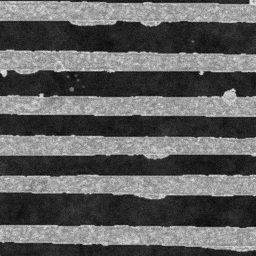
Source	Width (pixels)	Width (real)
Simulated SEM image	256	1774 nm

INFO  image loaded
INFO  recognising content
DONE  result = lines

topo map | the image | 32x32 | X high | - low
XXXXXXXXXXXXXXXXXXXXXXXXXXXX---X
XXXXXXXXXXXXXXXXXXXXXXXXXXXXXXXX
XXXXXXXXXXXXXXXXXXXXXXXXXXXXXXXX
--------------------------------
--------------------------------
--------------------------------
XXXXXXXXXX----------------------
XXXXXXXXXXXXXXXXXXXXXXXXXXXXXXXX
XXXXXXXXXXXXXXXXXXXXXXXXXXXXXXXX
--------------------------------
--------------------------------
----------------------------X---
XXXXXXXXXXXXXXXXXXXXXXXXXXXXXXXX
XXXXXXXXXXXXXXXXXXXXXXXXXXXXXXXX
-------------------------XXXXXXX
--------------------------------
--------------------------------
XXXXXXXXXXXXXXXXXXXXXXXXXXXXXXXX
XXXXXXXXXXXXXXXXXXXXXXXXXXXXXXXX
-------------------X------------
--------------------------------
--------------------------------
XXXXXXXXXXXXXXXXXXXXXXXXXXXXXXXX
XXXXXXXXXXXXXXXXXXXXXXXXXXXXXXXX
-------------------X------------
--------------------------------
--------------------------------
--------------------------------
XXXXXXXXXXXXXXXXXXXXXXXXXXXXXXXX
XXXXXXXXXXXXXXXXXXXXXXXXXXXXXXXX
----------XXXXX-XXXXXXXXXXXXXXXX
--------------------------------